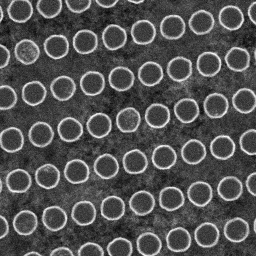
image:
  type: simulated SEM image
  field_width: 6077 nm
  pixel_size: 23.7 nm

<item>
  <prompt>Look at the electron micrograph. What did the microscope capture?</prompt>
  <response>a regular array of raised bodies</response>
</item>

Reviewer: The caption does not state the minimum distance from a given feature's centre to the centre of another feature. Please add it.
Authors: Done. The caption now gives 699 nanometres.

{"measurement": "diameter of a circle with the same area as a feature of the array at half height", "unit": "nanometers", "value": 562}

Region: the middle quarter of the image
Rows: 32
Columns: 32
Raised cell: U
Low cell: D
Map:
DDDDDDDDDDDDDDDDDDDDUUUUDDUUUUUU
DDDDDDDDDDDDUUUUDDDUUUUUDDUUUUUU
DDDDDDUUUDDDUUUUUDDUUUUUUDUUUUUU
UDDDDUUUUUDUUUUUUDDUUUUUDDDUUUUD
UUDDUUUUUUDUUUUUUDDDUUUUDDDDDDDD
UUUDUUUUUUDDUUUUUDDDDDDDDDDDDDDD
UUUDDUUUUDDDDDUDDDDDDDDDDDDDDDDD
UUDDDDUUDDDDDDDDDDDDDDDDDDDDDDDD
UDDDDDDDDDDDDDDDDDDDDDDDDDDDDDDD
DDDDDDDDDDDDDDDDDDDDDDDDDDDDDUUU
DDDDDDDDDDDDDDDDDDDDDDUUUDDDUUUU
DDDDDDDDDDDDDDDUUUDDDUUUUUDDUUUU
DDDDDDDDUUDDDDUUUUUDDUUUUUDDUUUU
DUDDDDDUUUUDDUUUUUUDUUUUUUDDDUUU
UUUUDDUUUUUUDUUUUUUDDUUUUUDDDDUD
UUUUDDUUUUUUDUUUUUDDDDUUUDDDDDDD
UUUUDDUUUUUUDDUUUUDDDDDDDDDDDDDD
UUUUDDDUUUUDDDDDDDDDDDDDDDDDDDDD
UUUUDDDDDDDDDDDDDDDDDDDDDDDDDDDD
DDDDDDDDDDDDDDDDDDDDDDDDDDDDDDDU
DDDDDDDDDDDDDDDDDDDDDDDDDUDDDDUU
DDDDDDDDDDDDDDDDDDDDDDDUUUUDDDUU
DDDDDDDDDDDDDDDDUUUUDDUUUUUUDDUU
DDDDDDDDDUUUDDDUUUUUUDUUUUUUDDUU
DDUUUDDDUUUUUDDUUUUUUDUUUUUUDDDU
DUUUUUDDUUUUUUDUUUUUUDDUUUUDDDDD
UUUUUUDDUUUUUDDUUUUUDDDDDDDDDDDD
UUUUUUDDUUUUUDDDDDDDDDDDDDDDDDDD
DUUUUUDDDDUDDDDDDDDDDDDDDDDDDDDD
DDUUDDDDDDDDDDDDDDDDDDDDDDDDDDDD
DDDDDDDDDDDDDDDDDDDDDDDDDDDDDDDD
DDDDDDDDDDDDDDDDDDDDDDDDDUUUUDDU